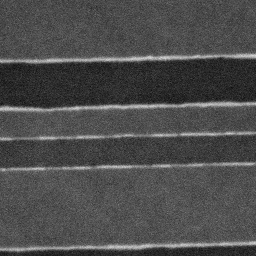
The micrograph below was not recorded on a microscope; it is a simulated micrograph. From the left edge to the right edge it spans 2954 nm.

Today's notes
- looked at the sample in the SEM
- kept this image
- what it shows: lines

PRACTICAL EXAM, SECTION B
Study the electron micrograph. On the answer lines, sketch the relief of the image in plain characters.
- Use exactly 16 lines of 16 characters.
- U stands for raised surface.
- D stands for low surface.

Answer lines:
UUUUUUUUUUUUUUUU
UUUUUUUUUUUUUUUU
UUUUUUUUUUUUUUUU
UUUUUUUUUUUUUUDD
DDDDDDDDDDDDDDDD
DDDDDDDDDDDDDDDD
DDDDDDDDDDDDDDDU
UUUUUUUUUUUUUUUU
UUUUUUUUUUUUUUUU
UUUUUUUUUUUUUUUU
UUUUUUUUUUUUUUUU
UUUUUUUUUUUUUUUU
UUUUUUUUUUUUUUUU
UUUUUUUUUUUUUUUU
UUUUUUUUUUUUUUUU
UUDDDDDDDDDDDDDD